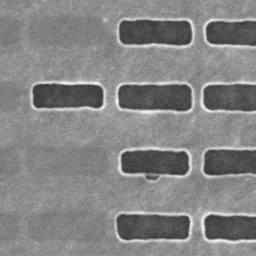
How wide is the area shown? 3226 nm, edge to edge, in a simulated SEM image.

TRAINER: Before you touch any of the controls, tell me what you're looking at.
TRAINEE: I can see holes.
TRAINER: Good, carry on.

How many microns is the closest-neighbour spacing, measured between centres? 0.819